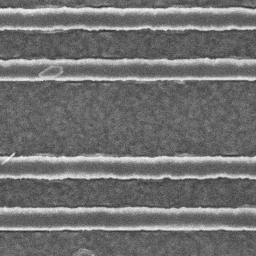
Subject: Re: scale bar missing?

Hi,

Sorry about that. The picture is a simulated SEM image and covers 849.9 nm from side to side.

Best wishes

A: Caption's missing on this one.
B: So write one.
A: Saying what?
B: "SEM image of lines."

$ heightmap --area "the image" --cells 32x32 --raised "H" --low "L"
LLLLLLLLLLLLLLLLLLLLLLLLLLLLLLLL
HHHHHHHHHHHHHHHHHHHHHHHHHHHHHHHH
HHHHHHHHHHHHHHHHHHHHHHHHHHHHHHHH
HHHHHHHHHHHHHHHHHHHHHHHHHHHHHHHH
LLLLLLLLLLLLLLLLLLLLLLLLLLLLLLLL
LLLLLLLLLLLLLLLLLLLLLLLLLLLLLLLL
LLLLLLLLLLLLLLLLLLLLLLLLLLLLLLLL
LLHLLHLHLLHHHLLHHHLLHLLLHHHHHLLL
HHHHHHHHHHHHHHHHHHHHHHHHHHHHHHHH
HHHHHHHHHHHHHHHHHHHHHHHHHHHHHHHH
LLLLLLLLLLLLLLLLLLLLLLLLLLLLLLLL
LLLLLLLLLLLLLLLLLLLLLLLLLLLLLLLL
LLLLLLLLLLLLLLLLLLLLLLLLLLLLLLLL
LLLLLLLLLLLLLLLLLLLLLLLLLLLLLLLL
LLLLLLLLLLLLLLLLLLLLLLLLLLLLLLLL
LLLLLLLLLLLLLLLLLLLLLLLLLLLLLLLL
LLLLLLLLLLLLLLLLLLLLLLLLLLLLLLLL
LLLLLLLLLLLLLLLLLLLLLLLLLLLLLLLL
LLLLLLLLLLLLLLLLLLLLLLLLLLLLLLLL
LLLLLLLLLLLLLLLLLLLLLLLLLLLLLLLL
HHHHHHHHHHHHHHHHHHHHHHHHHHHHHHHH
HHHHHHHHHHHHHHHHHHHHHHHHHHHHHHHH
LLLLLLLLLLLLLLLLLLLLLLLLLLLLLLLL
LLLLLLLLLLLLLLLLLLLLLLLLLLLLLLLL
LLLLLLLLLLLLLLLLLLLLLLLLLLLLLLLL
LLLLLLLLLLLLLLLLLLLLLLLLLLLLLLLL
HHHHHHHHHHHHHHHHHHHHHHHHHHHHHHHH
HHHHHHHHHHHHHHHHHHHHHHHHHHHHHHHH
HHHHHHHHHHHHHHHHHHHHHHHHHHHHHHHH
LLLLLLLLLLLLLLLLLLLLLLLLLLLLLLLL
LLLLLLLLLLLLLLLLLLLLLLLLLLLLLLLL
LLLLLLLLLLLLLLLLLLLLLLLLLLLLLLLL